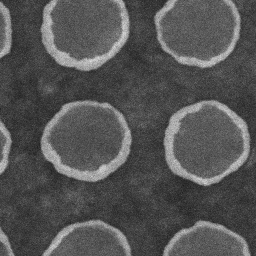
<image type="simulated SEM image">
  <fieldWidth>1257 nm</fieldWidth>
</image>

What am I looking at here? raised bodies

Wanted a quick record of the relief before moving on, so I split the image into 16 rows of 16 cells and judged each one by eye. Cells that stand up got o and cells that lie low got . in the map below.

...ooooo..ooooo.
o..ooooo..ooooo.
o..ooooo..ooooo.
...oooo....ooo..
................
................
.....o......oo..
...ooooo...oooo.
o..ooooo..ooooo.
...ooooo..ooooo.
....ooo....oooo.
................
................
................
....ooo....ooo..
o..ooooo...oooo.